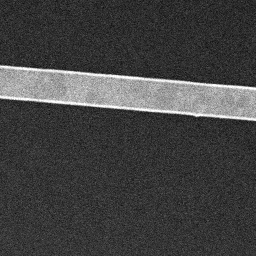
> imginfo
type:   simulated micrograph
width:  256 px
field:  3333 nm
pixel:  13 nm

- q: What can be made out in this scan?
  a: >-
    one or a few lines or trenches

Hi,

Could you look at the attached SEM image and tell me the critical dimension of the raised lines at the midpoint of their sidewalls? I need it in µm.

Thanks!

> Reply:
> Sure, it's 0.396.